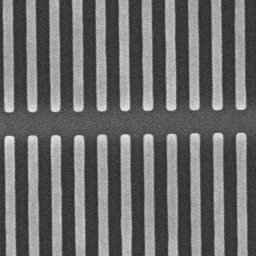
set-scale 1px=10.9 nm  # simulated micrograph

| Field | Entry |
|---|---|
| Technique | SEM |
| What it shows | groups of lines, slits or small figures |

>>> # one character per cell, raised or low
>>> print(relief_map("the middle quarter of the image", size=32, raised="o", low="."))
..ooo...oo....oo....oo....oo...o
..ooo...oo....oo....oo....oo...o
...oo...oo....oo....oo....oo...o
...oo...oo....oo....oo....oo...o
...oo...ooo...oo....oo....oo...o
...oo...ooo...oo....oo....oo...o
...oo...ooo...oo....oo....oo....
...oo...oo....oo....oo....oo....
...oo...oo....oo....oo....oo....
...oo...oo....oo....oo....oo....
...oo...ooo...oo....oo....oo....
...o.....o.....o....oo....oo....
................................
................................
................................
................................
................................
................................
...oo...ooo...oo....oo....oo....
...oo...ooo...oo....oo....oo....
...oo...ooo...oo....oo....oo....
...oo...ooo...oo....oo....oo....
...oo...ooo...oo....oo....oo....
...oo...ooo...oo....oo....oo....
...oo...ooo...oo....oo....oo....
...oo...ooo...oo....oo....oo....
...oo....oo...oo....oo....oo....
...oo....oo...oo....oo....oo....
...oo....oo...oo....oo....oo....
...oo....oo...oo....oo....oo....
...oo....oo...oo....oo....oo....
...oo....oo....o....oo....oo....